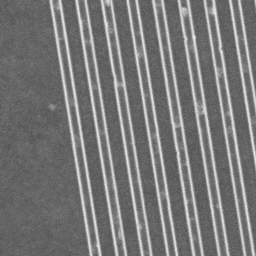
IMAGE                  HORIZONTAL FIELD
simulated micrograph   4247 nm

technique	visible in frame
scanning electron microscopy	parallel lines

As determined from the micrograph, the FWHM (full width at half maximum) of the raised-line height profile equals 154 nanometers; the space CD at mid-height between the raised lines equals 264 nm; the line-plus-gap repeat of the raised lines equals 420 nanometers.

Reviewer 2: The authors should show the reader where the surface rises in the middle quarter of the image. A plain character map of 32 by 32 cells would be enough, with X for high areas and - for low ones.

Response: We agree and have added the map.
X-----XX----XX-----XX----XX----X
XX----XX----XXX----XX----XX----X
XX----XX-----XX----XX----XX-----
XX----XXX----XX----XX----XXX----
XX----XXX----XX----XX-----XX----
XX-----XX----XX----XXX----XX----
XX-----XX----XX----XXX----XX----
XXX----XX----XX-----XX----XX----
-XX----XX----XXX----XX----XX----
-XX----XX-----XX----XX----XXX---
-XX----XXX----XX----XX----XXX---
-XX-----XX----XX----XX-----XX---
-XX-----XX----XX----XXX----XX---
-XXX----XX----XX-----XX----XX---
-XXX----XX----XXX----XX----XX---
--XX----XX-----XX----XX----XX---
--XX----XXX----XX----XX----XXX--
--XX-----XX----XX----XX-----XX--
--XX-----XX----XX----XXX----XX--
--XX-----XX----XX-----XX----XX--
--XXX----XX----XXX----XX----XX--
---XX----XX-----XX----XX----XX--
---XX----XXX----XX----XX-----XX-
---XX----XXX----XX----XX-----XX-
---XX-----XX----XX----XXX----XX-
---XX-----XX----XX----XXX----XX-
---XXX----XX----XX-----XX----XX-
----XX----XX----XXX----XX----XX-
----XX----XX-----XX----XX----XXX
----XX----XXX----XX----XX----XXX
----XX-----XX----XX----XX-----XX
----XX-----XX----XX----XXX----XX